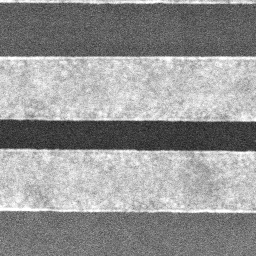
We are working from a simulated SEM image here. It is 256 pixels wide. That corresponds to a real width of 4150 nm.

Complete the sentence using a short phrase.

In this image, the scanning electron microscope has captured lines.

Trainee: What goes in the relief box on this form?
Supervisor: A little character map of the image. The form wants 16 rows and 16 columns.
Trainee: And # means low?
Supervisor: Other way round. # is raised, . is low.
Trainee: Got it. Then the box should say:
................
................
................
................
################
################
################
............####
................
##############..
################
################
################
................
................
................